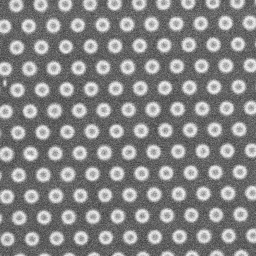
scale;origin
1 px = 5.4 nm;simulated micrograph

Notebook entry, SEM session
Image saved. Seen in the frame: an array of small figures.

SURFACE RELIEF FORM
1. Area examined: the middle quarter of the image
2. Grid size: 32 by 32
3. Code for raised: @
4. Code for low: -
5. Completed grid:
--@@@---@@@---@@@@--@@@@--@@@@--
--@@@---@@@---@@@@--@@@@---@@@--
---@@----@@----@@---------------
--------------------------------
------------@@----@@----@@----@@
@@---@@@---@@@@--@@@@---@@@---@@
@@---@@@@--@@@@--@@@@---@@@---@@
@@---@@@----@@----@@----@@----@@
--------------------------------
----------------------------@---
--@@@---@@@----@@@--@@@@---@@@--
--@@@@--@@@@--@@@@--@@@@---@@@--
--@@@---@@@----@@@---@@@---@@@--
--------------------------------
--------------------------------
@@----@@----@@----@@@---@@@---@@
@@@--@@@@--@@@@--@@@@---@@@---@@
@@@--@@@@--@@@@---@@@---@@@---@@
@@----@@----@@------------------
--------------------------------
---@-----@@----@@----@@----@@@--
--@@@@--@@@@---@@@---@@@---@@@--
--@@@@--@@@@--@@@@---@@@---@@@--
---@@----@@----@@----@@-----@---
--------------------------------
-------------------------------@
@@@---@@@---@@@---@@@---@@@---@@
@@@--@@@@--@@@@---@@@---@@@---@@
@@@---@@@---@@@---@@@---@@@---@@
@@------------------------------
--------------------------------
---@@----@@----@@@---@@@---@@@--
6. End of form